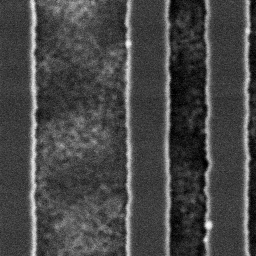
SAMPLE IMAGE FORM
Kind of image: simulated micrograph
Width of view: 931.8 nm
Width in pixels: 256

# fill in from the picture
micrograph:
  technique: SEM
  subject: lines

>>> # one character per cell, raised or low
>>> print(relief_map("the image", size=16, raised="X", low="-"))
XX------XXX--XXX
XX------XXX--XXX
XX------XXX--XXX
XX------XXX--XX-
XX------XXX--XXX
XX------XXX--XX-
XX------XXX--XXX
XX------XXX--XX-
XX------XXX--XX-
XX------XXX--XXX
XX------XXX--XXX
XX------XXX--XX-
XX------XXX--XX-
XX------XXX--XX-
XX------XXX--XX-
XX------XXX--XXX